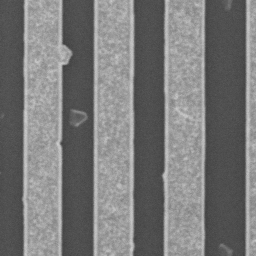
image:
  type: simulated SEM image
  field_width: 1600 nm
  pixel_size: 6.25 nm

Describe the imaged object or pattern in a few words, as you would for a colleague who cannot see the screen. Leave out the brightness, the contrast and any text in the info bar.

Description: one or a few lines or trenches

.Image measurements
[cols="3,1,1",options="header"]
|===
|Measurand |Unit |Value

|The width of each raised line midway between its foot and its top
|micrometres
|0.226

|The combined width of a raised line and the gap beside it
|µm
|0.443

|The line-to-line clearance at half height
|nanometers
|219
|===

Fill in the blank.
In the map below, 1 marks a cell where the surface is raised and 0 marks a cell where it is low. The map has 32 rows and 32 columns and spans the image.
00011111000011110000011110000001
00011110000011110000011110000001
00011110000011110000011110000001
00011110000011110000011110000001
00011110000011110000011110000001
00011111000011110000011110000001
00011111100011110000011110000001
00011111100011110000011110000001
00011111000011110000011110000001
00011110000011110000011110000001
00011110000011110000011110000001
00011110000011110000011110000001
00011110000011110000011110000001
00011110000011110000011110000001
00011110000011110000011110000001
00011110000011110000011110000001
00011110000011110000011110000001
00011110000011110000011110000001
00011110000011110000011110000001
00011110000011110000011110000001
00011110000011110000011110000001
00011110000011110000011110000001
00011110000011110000011110000001
00011110000011110000011110000001
00011110000011110000011110000001
00011110000011110000011110000001
00011110000011110000011110000001
00011110000011110000011110000001
00011110000011110000011110000001
00011110000011110000011110000001
00011110000011110000011110000001
00011110000011110000011110000001